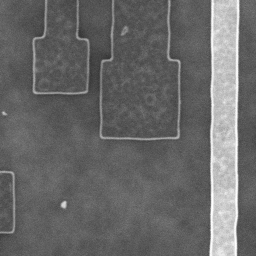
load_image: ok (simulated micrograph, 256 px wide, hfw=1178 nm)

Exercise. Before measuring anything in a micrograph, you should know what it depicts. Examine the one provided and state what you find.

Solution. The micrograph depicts groups of lines, slits or small figures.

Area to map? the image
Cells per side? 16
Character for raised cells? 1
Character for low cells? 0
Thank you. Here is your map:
0001100111100110
0001100111100110
0011100111100110
0011110111100110
0011111111100110
0011101111100110
0000001111100110
0000001111100110
0000000111100110
0000000000000110
0000000000000110
1000000000000110
1000000000000110
1000000000000110
0000000000000110
0000000000000110